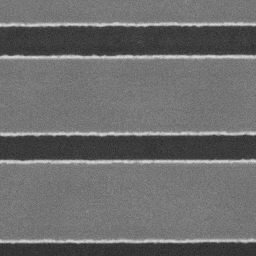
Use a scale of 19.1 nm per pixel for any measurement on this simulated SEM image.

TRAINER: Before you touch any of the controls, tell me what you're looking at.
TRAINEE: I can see lines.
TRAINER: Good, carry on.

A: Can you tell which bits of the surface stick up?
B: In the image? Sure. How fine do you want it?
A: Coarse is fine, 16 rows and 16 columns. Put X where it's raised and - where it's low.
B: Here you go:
XXXXXXXXXXXXXXXX
XXXXXXXXXXXXXXXX
----------------
-------------X--
XXXXXXXXXXXXXXXX
XXXXXXXXXXXXXXXX
XXXXXXXXXXXXXXXX
XXXXXXXXXXXXXXXX
----------------
----------------
XXXXXXXXXXXXXXXX
XXXXXXXXXXXXXXXX
XXXXXXXXXXXXXXXX
XXXXXXXXXXXXXXXX
XXXXXXXXXXXXXXXX
----------------